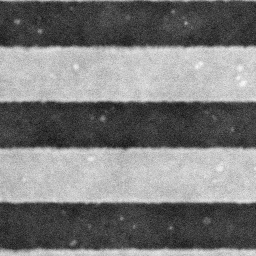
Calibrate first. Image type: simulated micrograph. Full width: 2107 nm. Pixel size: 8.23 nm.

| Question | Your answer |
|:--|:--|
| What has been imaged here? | lines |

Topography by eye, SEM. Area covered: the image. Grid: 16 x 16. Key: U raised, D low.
DDDDDDDDDDDDDDDD
DDDDDDDDDDDDDDDD
DDDDDDDDDDDDDDDD
UUUUUUUUUUUUUUUU
UUUUUUUUUUUUUUUU
UUUUUUUUUUUUUUUU
DDDDDDDDDDDDDDDD
DDDDDDDDDDDDDDDD
DDDDDDDDDDDDDDDD
UUUUUUUUUUUUUUUU
UUUUUUUUUUUUUUUU
UUUUUUUUUUUUUUUU
UUUUUUUUUUUUUUUU
DDDDDDDDDDDDDDDD
DDDDDDDDDDDDDDDD
DDDDDDDDDDDDDDDD